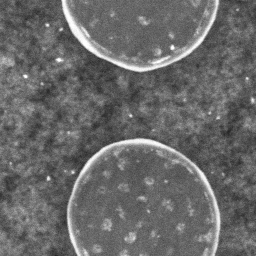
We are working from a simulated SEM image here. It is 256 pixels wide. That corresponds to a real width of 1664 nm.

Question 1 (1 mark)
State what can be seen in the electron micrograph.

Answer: raised bodies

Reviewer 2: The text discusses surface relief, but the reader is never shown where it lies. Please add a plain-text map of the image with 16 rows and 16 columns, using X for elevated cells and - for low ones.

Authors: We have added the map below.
----XXXXXXXXXX--
----XXXXXXXXX---
-----XXXXXXXX---
------XXXXX-----
----------------
----------------
----------------
----------------
----------------
------XXXXX-----
-----XXXXXXX----
-----XXXXXXXX---
----XXXXXXXXX---
----XXXXXXXXXX--
----XXXXXXXXXX--
-----XXXXXXXXX--